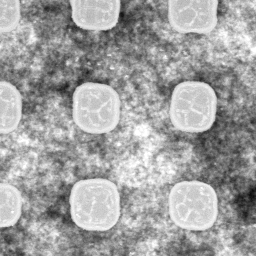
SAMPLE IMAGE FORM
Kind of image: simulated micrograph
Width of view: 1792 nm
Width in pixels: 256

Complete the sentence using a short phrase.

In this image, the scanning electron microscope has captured raised bodies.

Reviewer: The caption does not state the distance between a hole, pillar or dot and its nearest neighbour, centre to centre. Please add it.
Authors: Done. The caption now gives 679 nanometers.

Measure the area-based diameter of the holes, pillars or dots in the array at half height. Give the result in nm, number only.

340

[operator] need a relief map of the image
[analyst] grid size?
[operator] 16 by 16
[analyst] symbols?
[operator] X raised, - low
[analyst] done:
X---XXX----XXX--
X----XX----XX---
----------------
----------------
----------------
X----XX----XX---
X----XX----XX---
X----XX----XX---
----------------
----------------
----------------
-----XX----XX---
X----XX----XXX--
X----XX----XX---
----------------
----------------